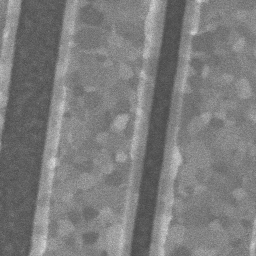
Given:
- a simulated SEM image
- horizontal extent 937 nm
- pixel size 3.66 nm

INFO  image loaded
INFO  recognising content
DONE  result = one or a few lines or trenches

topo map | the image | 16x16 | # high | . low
#...######..####
#...######..####
#...######..####
....######..####
....#####..#####
....#####..#####
....#####..#####
...######..#####
...######..#####
...######..#####
...######..#####
...#####..######
...#####..######
...#####..######
..######..######
..######..######